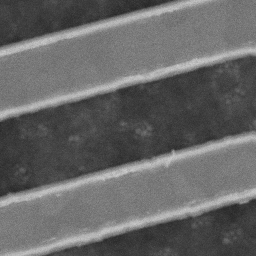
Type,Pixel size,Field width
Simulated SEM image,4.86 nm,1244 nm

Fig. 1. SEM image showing one or a few lines or trenches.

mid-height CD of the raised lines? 55.3 pixels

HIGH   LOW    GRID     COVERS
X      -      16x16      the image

-----------XXXXX
-------XXXXXXXXX
---XXXXXXXXXXXXX
XXXXXXXXXXXXXX--
XXXXXXXXXX------
XXXXXX----------
XXX-------------
----------------
----------------
------------XXXX
--------XXXXXXXX
-----XXXXXXXXXXX
XXXXXXXXXXXXXX--
XXXXXXXXXX------
XXXXXXX---------
XXX-------------